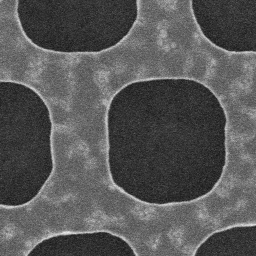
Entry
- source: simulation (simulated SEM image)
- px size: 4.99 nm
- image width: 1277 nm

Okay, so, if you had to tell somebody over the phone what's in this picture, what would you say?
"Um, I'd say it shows holes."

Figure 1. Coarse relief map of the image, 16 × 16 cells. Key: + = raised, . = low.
+........+++....
+.......++++....
++......+++++...
++++++++++++++++
++++++++++++++++
..++++++.....+++
...++++.......++
...++++.......++
...++++.......++
...++++.......++
...++++.......++
...++++......+++
..+++++++...++++
++++++++++++++++
++++++++++++++..
++......++++....